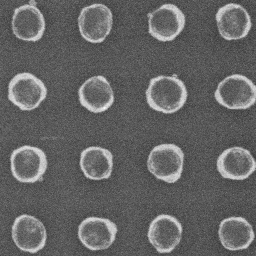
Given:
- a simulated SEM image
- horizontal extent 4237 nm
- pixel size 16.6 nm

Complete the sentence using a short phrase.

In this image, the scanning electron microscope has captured a regular array of raised bodies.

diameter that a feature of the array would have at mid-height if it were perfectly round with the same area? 0.545 microns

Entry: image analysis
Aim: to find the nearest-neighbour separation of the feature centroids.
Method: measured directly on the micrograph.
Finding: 68.3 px